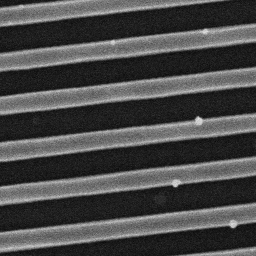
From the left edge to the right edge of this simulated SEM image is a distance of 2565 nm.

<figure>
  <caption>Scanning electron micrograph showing lines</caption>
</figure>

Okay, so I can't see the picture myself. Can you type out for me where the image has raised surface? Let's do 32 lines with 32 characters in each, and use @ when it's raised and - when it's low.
-----@@@@@@@@@@@@@@@@@@@--------
@@@@@@@@@@@@@@@-----------------
@@@@@@@-------------------------
----------------------------@@@@
------------------@@@@@@@@@@@@@@
-----------@@@@@@@@@@@@@@@@@@---
--@@@@@@@@@@@@@@@@@@@-----------
@@@@@@@@@@@---------------------
@@@@---------------------------@
-----------------------@@@@@@@@@
--------------@@@@@@@@@@@@@@@@@@
-----@@@@@@@@@@@@@@@@@@@@-------
@@@@@@@@@@@@@@@@----------------
@@@@@@@@------------------------
-----------------------------@@@
---------------------@@@@@@@@@@@
-----------@@@@@@@@@@@@@@@@@@@@-
----@@@@@@@@@@@@@@@@@@----------
@@@@@@@@@@@@@-------------------
@@@@@@--------------------------
-------------------------@@@@@@@
----------------@@@@@@@@@@@@@@@@
--------@@@@@@@@@@@@@@@@@@@-----
@@@@@@@@@@@@@@@@@@--------------
@@@@@@@@@@----------------------
@------------------------------@
-----------------------@@@@@@@@@
--------------@@@@@@@@@@@@@@@@@@
-----@@@@@@@@@@@@@@@@@@@@@------
@@@@@@@@@@@@@@@@@---------------
@@@@@@@@@-----------------------
---------------------------@@@@@